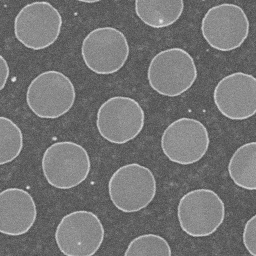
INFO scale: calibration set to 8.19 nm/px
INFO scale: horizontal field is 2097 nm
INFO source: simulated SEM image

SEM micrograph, a regular array of raised bodies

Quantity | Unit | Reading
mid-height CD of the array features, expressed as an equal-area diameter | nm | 376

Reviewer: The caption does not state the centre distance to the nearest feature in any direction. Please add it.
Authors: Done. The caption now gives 575 nm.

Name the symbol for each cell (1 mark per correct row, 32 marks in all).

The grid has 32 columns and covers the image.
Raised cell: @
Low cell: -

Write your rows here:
----@@-----------@@@@@@---------
---@@@@----------@@@@@@---@@@@--
--@@@@@@----------@@@@---@@@@@@-
--@@@@@------------------@@@@@@-
--@@@@@----@@@@-----------@@@@@-
---@@@----@@@@@@----------@@@@--
----------@@@@@@----@@@---------
-----------@@@@@---@@@@@--------
@----------@@@@----@@@@@--------
@----@@@-----------@@@@@-----@@-
@---@@@@@----------@@@@@---@@@@@
---@@@@@@-----------@@@----@@@@@
---@@@@@@-----@@-----------@@@@@
----@@@@@----@@@@@---------@@@@@
-----@@-----@@@@@@----------@@@-
@@----------@@@@@@----@@@-------
@@@----------@@@@----@@@@@------
@@@-----------@@----@@@@@@------
@@@---@@@@----------@@@@@@----@@
@@----@@@@@----------@@@@----@@@
-----@@@@@@------------------@@@
------@@@@@----@@@@----------@@@
------@@@@----@@@@@----------@@@
--------------@@@@@------------@
@@@@----------@@@@@----@@@@-----
@@@@----------@@@@----@@@@@@----
@@@@------@-----------@@@@@@----
@@@@----@@@@----------@@@@@@---@
@@@@---@@@@@@----------@@@@----@
-------@@@@@@-----@@-----------@
-------@@@@@----@@@@@----------@
--------@@@@----@@@@@----------@